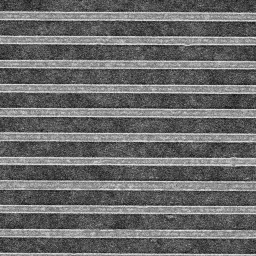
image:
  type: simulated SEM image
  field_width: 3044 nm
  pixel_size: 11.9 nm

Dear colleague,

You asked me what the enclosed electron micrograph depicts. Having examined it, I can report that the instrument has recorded parallel lines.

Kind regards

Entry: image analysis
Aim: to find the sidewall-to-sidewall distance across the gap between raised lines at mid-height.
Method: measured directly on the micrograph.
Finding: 199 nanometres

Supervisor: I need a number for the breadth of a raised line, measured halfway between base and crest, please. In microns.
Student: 0.0847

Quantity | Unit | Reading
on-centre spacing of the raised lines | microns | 0.287